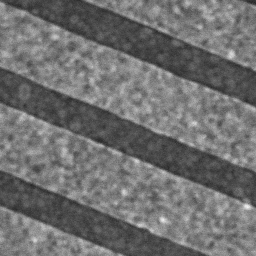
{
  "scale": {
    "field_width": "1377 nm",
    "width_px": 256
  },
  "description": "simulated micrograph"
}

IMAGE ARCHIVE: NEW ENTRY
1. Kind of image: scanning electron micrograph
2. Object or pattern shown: one or a few lines or trenches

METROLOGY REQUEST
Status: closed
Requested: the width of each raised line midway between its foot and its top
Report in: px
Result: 59.8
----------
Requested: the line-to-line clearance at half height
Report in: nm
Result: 186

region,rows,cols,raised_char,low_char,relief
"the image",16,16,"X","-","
X------XXXXXXXXX
XXX------XXXXXXX
XXXXX------XXXXX
XXXXXXXX------XX
-XXXXXXXXX------
---XXXXXXXXXX---
------XXXXXXXXX-
XXX-----XXXXXXXX
XXXXX------XXXXX
XXXXXXX------XXX
XXXXXXXXXX-----X
--XXXXXXXXXX----
-----XXXXXXXXXX-
X------XXXXXXXXX
XXXX------XXXXXX
XXXXXX------XXXX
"